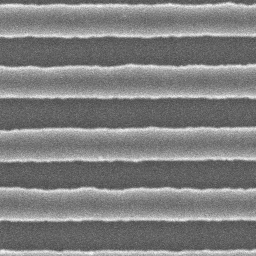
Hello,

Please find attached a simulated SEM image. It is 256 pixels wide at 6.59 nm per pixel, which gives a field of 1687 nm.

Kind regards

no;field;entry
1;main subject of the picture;lines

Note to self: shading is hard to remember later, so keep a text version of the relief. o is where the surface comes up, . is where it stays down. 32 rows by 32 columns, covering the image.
.....................o.....ooo..
oooooooooooooooooooooooooooooooo
oooooooooooooooooooooooooooooooo
oooooooooooooooooooooooooooooooo
ooooooooooooo.ooooooo.o.........
................................
................................
................................
ooooo.oooooooooooooooooooooooooo
oooooooooooooooooooooooooooooooo
oooooooooooooooooooooooooooooooo
oooooooooooooooooooooooooooooooo
................................
................................
................................
................................
oooooooooooooooooooooooooooooooo
oooooooooooooooooooooooooooooooo
oooooooooooooooooooooooooooooooo
oooooooooooooooooooooooooooooooo
................................
................................
................................
................................
oooooooooooooooooooooooooooooooo
oooooooooooooooooooooooooooooooo
oooooooooooooooooooooooooooooooo
ooooooooooo..ooo....oooo..oo....
................................
................................
................................
ooooooo.oo.oooooooooo.oooooooooo